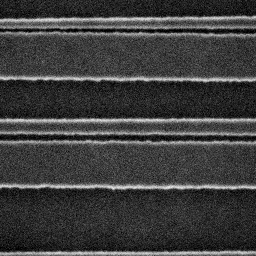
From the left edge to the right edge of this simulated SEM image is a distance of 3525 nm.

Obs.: lines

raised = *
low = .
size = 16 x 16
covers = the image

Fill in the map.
................
****************
****************
****************
****************
................
................
**..************
****************
****************
****************
****************
................
................
................
................